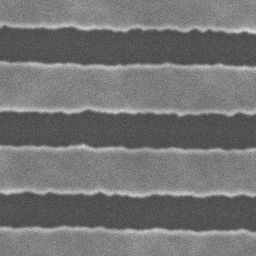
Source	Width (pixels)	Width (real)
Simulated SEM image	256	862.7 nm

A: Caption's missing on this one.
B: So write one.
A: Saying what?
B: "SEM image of lines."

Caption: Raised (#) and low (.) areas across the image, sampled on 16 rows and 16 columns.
################
################
................
................
################
################
################
................
................
################
################
################
................
................
################
################